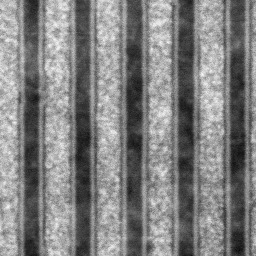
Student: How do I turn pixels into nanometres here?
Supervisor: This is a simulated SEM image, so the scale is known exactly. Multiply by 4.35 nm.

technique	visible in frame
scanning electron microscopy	parallel lines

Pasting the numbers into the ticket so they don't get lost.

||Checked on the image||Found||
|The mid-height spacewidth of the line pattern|32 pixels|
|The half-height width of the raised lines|0.0853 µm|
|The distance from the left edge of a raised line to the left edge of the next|224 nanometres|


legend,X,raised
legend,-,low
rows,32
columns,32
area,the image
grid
---XX----XXX----XX----XX-----XX-
---XX----XXX----XX----XX-----XX-
---XX----XX-----XX----XX-----XX-
---XX----XX-----XX----XX-----XX-
---XX----XX-----XX----XX-----XX-
---XX----XX-----XX----XX-----XX-
---XX----XX-----XX----XX-----XX-
---XX----XX-----XX----XX-----XX-
---XX----XX-----XX----XX-----XX-
---XX----XX-----XX----XX-----XX-
---XX----XX-----XX----XX-----XX-
---XX----XX-----XX----XX-----XX-
---XX----XXX----XX----XXX----XX-
---XX----XXX----XX----XXX----XX-
---XX----XXX----XX----XX-----XX-
---XX----XXX----XX----XX-----XX-
---XX----XXX----XX----XX-----XX-
---XX----XXX----XX----XXX----XX-
---XX----XXX----XX----XXX----XX-
---XX----XXX----XX----XXX----XX-
---XX----XXX----XX----XXX----XX-
---XX----XXX----XX----XXX----XX-
---XX----XXX----XX----XX-----XX-
---XX----XXX----XX----XX-----XX-
---XX----XXX----XX----XX-----XX-
---XX----XXX----XX----XX-----XX-
---XX----XXX----XX----XX-----XX-
---XX----XXX----XX----XX-----XX-
---XX----XXX----XX----XX-----XX-
---XX----XXX----XX----XX-----XX-
---XX----XXX----XX----XX-----XX-
---XX----XXX----XX----XXX----XX-